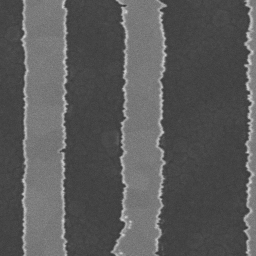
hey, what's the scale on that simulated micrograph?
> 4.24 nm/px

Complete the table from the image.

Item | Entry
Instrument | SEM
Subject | one or a few lines or trenches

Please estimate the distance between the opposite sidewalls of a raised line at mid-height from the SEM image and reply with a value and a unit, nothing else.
165 nanometers